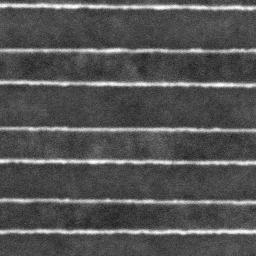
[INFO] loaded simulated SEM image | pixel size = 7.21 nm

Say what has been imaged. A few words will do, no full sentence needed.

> lines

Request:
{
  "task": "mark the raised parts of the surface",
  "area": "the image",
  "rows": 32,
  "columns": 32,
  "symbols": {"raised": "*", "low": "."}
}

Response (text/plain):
********************************
................................
................................
................................
................................
................................
********************************
********************************
********************************
********************************
.......**..*********************
................................
................................
................................
................................
................................
********************************
********************************
********************************
********************************
................................
................................
................................
................................
................................
********************************
********************************
********************************
********************************
................................
................................
................................